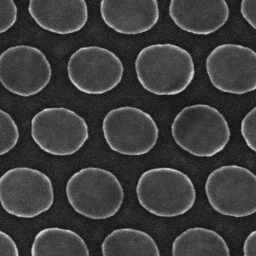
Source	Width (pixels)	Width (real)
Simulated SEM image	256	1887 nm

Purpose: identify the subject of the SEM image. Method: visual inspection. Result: raised bodies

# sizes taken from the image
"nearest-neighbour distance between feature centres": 520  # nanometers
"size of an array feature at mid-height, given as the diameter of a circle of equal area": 390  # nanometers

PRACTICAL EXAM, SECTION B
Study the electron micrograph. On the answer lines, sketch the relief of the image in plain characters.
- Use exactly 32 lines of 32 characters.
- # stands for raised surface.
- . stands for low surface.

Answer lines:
##..#######..#######.#######..##
##..#######..#######.#######..##
##..#######..#######..######...#
#.....####....#####....####.....
................................
................................
.####.....####....#####....#####
######...######..#######..######
######...######..#######..######
######...######..#######..######
######...######...#####....#####
..###......##......###.......##.
................................
...............##......####.....
#...######...#####....######...#
##..#######..######...######..##
##..#######..#######..#######.##
##..#######..#######..######...#
#....#####....#####....#####...#
.........................#......
................................
.####.....###.....#####....####.
######...######...######..######
######..#######..#######..######
#######.#######..#######..######
######...######...######..######
.####.....#####....####....#####
................................
........................#.......
#....#####....#####...#####....#
##..#######..######...######...#
##..#######..#######..#######..#